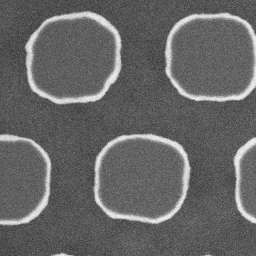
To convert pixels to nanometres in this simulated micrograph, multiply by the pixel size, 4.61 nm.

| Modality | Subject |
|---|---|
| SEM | raised bodies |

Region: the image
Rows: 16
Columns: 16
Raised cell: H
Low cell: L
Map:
LLLLLLLLLLLLLLLL
LLLHHHHLLLLHHHHL
LLHHHHHLLLLHHHHH
LLHHHHHLLLLHHHHH
LLHHHHHLLLLHHHHH
LLHHHHHLLLLHHHHH
LLLLLLLLLLLLLLLL
LLLLLLLLLLLLLLLL
LLLLLLLLHLLLLLLL
HHHLLLHHHHHLLLLH
HHHLLLHHHHHHLLLH
HHHLLLHHHHHHLLLH
HHHLLLHHHHHLLLLH
HHLLLLLHHHHLLLLH
LLLLLLLLLLLLLLLL
LLLLLLLLLLLLLLLL